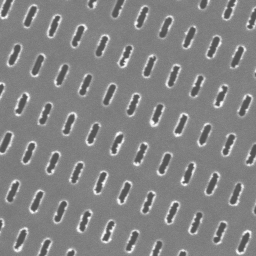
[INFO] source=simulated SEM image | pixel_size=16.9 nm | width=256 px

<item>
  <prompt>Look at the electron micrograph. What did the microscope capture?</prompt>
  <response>a regular array of holes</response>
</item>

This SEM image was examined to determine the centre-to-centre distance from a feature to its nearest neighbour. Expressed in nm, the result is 435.